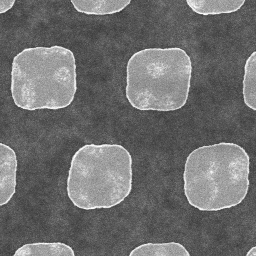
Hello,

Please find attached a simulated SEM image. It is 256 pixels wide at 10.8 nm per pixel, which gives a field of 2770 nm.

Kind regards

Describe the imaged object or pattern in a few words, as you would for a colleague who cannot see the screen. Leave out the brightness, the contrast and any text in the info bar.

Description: raised bodies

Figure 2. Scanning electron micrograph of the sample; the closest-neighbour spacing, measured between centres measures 1230 nm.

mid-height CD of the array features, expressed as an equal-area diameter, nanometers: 730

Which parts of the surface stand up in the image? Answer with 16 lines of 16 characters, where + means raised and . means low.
+....+++....+++.
................
................
.++++...++++....
.++++...++++...+
.++++...++++...+
.+++....+++.....
................
................
+....+++....+++.
+...++++....++++
+...++++....+++.
.....+++....+++.
................
................
..++.....++.....